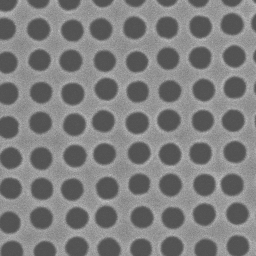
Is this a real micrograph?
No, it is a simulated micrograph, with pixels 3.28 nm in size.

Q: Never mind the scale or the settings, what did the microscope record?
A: a regular array of holes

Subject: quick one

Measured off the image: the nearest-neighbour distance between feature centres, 97.7 nm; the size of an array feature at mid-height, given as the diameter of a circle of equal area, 73.7 nanometers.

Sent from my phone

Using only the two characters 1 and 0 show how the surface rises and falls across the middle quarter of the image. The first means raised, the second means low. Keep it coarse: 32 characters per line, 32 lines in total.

00001111000001110000011100001111
00011111000011110000111111111111
11111111111111111111111111111111
11111111110111111111111111111111
11111111000001111000111110001111
00001111000001110000011100000111
00000111000000110000011100000111
00000111000001110000011100000111
00000111100011110000011100000111
00001111111111111001111110011111
11111111111111111111111111111111
11111111111111111111111110011111
11001111000011111000111100000111
00000110000001110000011000000111
00000110000001100000011000000111
00000110000011100000011100000111
00000111000011110000011110011111
10001111111111111101111111111111
11111111111111111111111111111111
11111111111111111110111111111111
10001111000011111000011110001111
00000110000001110000001100000110
00000010000001110000001100000110
00000011000001110000011100000111
00000111000011111000111100000111
11001111111111111111111111011111
11111111111111111111111111111111
11111111111111111101111111011111
11011111110011110000011100000111
00001111100001110000001100000111
00000111000000110000001100000111
00000111000000110000011100000111